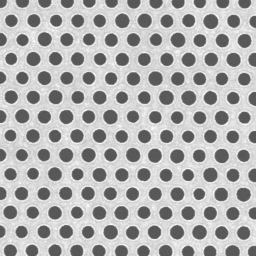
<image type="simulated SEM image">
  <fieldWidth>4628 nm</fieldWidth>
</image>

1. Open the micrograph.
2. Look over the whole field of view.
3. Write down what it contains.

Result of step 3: a regular array of holes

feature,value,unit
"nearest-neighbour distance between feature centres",0.394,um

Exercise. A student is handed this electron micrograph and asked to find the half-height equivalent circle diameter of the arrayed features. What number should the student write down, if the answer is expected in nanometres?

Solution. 243